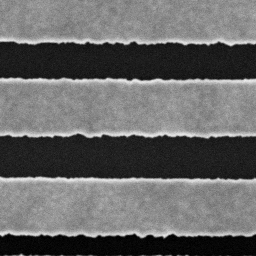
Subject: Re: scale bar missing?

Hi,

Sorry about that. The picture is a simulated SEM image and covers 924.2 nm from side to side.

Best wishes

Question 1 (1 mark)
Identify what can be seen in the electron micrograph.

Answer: lines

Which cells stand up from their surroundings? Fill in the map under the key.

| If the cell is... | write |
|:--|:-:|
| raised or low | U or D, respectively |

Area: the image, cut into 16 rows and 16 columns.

UUUUUUUUUUUUUUUU
UUUUUUUUUUUUUUUU
UUUUUUUUUUUUUUUU
DDDDDDDDDDDDDDDD
DDDDDDDDDDDDDDDD
UUUUUUUUUUUUUUUU
UUUUUUUUUUUUUUUU
UUUUUUUUUUUUUUUU
DUUUDUDUDUUUUUUU
DDDDDDDDDDDDDDDD
DDDDDDDDDDDDDDDD
UUUUUUUUUUUUUUUU
UUUUUUUUUUUUUUUU
UUUUUUUUUUUUUUUU
UUUUUUUUUUUUUUUU
DDDDDDDDDDDDDDDD